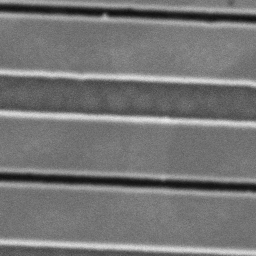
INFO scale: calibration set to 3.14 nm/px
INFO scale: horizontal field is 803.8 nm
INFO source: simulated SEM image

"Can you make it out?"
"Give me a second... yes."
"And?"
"one or a few lines or trenches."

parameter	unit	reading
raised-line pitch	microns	0.266